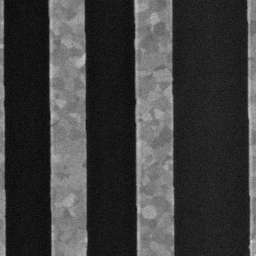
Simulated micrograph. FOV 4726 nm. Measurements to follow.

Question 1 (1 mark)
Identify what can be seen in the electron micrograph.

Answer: lines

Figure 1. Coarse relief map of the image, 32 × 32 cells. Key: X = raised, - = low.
------XXXX-------XXXX----------X
------XXXX-------XXXX----------X
------XXXX-------XXXX----------X
------XXXX-------XXXX----------X
------XXXXX------XXXX----------X
------XXXXX------XXXX----------X
------XXXXX------XXXX----------X
------XXXXX------XXXX----------X
------XXXXX------XXXX----------X
------XXXXX------XXXX----------X
------XXXXX------XXXX----------X
------XXXXX------XXXXX---------X
------XXXXX------XXXXX---------X
------XXXXX------XXXXX---------X
------XXXXX------XXXXX---------X
------XXXXX------XXXXX---------X
------XXXXX------XXXXX---------X
------XXXXX------XXXXX---------X
------XXXXX------XXXXX---------X
------XXXXX------XXXXX---------X
------XXXXX------XXXXX---------X
------XXXXX------XXXXX---------X
------XXXXX------XXXXX---------X
X-----XXXXX------XXXXX---------X
X-----XXXXX------XXXXX---------X
X-----XXXXX------XXXXX---------X
X-----XXXXX------XXXXX---------X
X------XXXX------XXXXX---------X
X------XXXX------XXXXX---------X
X------XXXX------XXXXX---------X
X------XXXX------XXXXX---------X
X------XXXX------XXXXX---------X